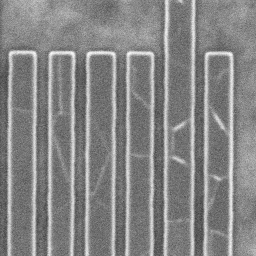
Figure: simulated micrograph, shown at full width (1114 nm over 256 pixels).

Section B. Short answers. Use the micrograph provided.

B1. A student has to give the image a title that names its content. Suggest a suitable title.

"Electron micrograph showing wiring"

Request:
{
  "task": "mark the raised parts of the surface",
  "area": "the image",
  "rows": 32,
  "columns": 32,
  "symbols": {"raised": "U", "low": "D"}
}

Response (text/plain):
DDDDDDDDDDDDDDDDDDDDDUUUDDDDDDDD
DDDDDDDDDDDDDDDDDDDDDUUUDDDDDDDD
DDDDDDDDDDDDDDDDDDDDDUUUDDDDDDDD
DDDDDDDDDDDDDDDDDDDDDUUUDDDDDDDD
DDDDDDDDDDDDDDDDDDDDDUUUDDDDDDDD
DDDDDDDDDDDDDDDDDDDDDUUUDDDDDDDD
DDUUDDDDDDDDDDDDDDDDDUUUDDDDDDDD
DUUUDDUUUDDUUUDDUUUDDUUUDDUUUDDD
DUUUDDUUUDDUUUDDUUUDDUUUDDUUUDDD
DUUUDDUUUDDUUUDDUUUDDUUUDDUUUDDD
DUUUDDUUUDDUUUDDUUUDDUUUDDUUUDDD
DUUUDDUUUDDUUUDDUUUDDUUUDDUUUDDD
DUUUDDUUUDDUUUDDUUUDDUUUDDUUUDDD
DUUUDDUUUDDUUUDDUUUDDUUUDDUUUDDD
DUUUDDUUUDDUUUDDUUUDDUUUDDUUUDDD
DUUUDDUUUDDUUUDDUUUDDUUUDDUUUDDD
DUUUDDUUUDDUUUDDUUUDDUUUDDUUUDDD
DUUUDDUUUDDUUUDDUUUDDUUUDDUUUDDD
DUUUDDUUUDDUUUDDUUUDDUUUDDUUUDDD
DUUUDDUUUDDUUUDDUUUDDUUUDDUUUDDD
DUUUDDUUUDDUUUDDUUUDDUUUDDUUUDDD
DUUUDDUUUDDUUUDDUUUDDUUUDDUUUDDD
DUUUDDUUUDDUUUDDUUUDDUUUDDUUUDDD
DUUUDDUUUDDUUUDDUUUDDUUUDDUUUDDD
DUUUDDUUUDDUUUDDUUUDDUUUDDUUUDDD
DUUUDDUUUDDUUUDDUUUDDUUUDDUUUDDD
DUUUDDUUUDDUUUDDUUUDDUUUDDUUUDDD
DUUUDDUUUDDUUUDDUUUDDUUUDDUUUDDD
DUUUDDUUUDDUUUDDUUUDDUUUDDUUUDDD
DUUUDDUUUDDUUUDDUUUDDUUUDDUUUDDD
DUUUDDUUUDDUUUDDUUUDDUUUDDUUUDDD
DUUUDDUUUDDUUUDDUUUDDUUUDDUUUDDD